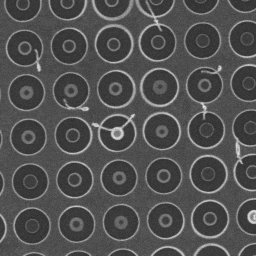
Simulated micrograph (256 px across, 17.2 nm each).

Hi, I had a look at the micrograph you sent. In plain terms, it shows an array of small figures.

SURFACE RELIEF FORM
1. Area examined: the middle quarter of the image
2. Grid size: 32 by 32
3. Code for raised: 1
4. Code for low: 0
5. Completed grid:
11111111111111111111111111111111
11111111111111111111110001111111
00011111111000001111100000011111
00000111100000000111000000001110
00000011100000000111000000001110
01000011000011000110000110000110
01100011000011000010000110001110
01100011100010000111000000001110
00000011100000000111000000001111
00000111110000001111100000011111
00001111111000011111111101111111
11111111111111111111111111111111
11111111111111111111111000111111
10011111111000001111100000011111
00000111110000000111000000001110
00000011100000000111000000000110
01100001100011000011000111000110
01110001100011000011000110000110
01110001100001000011000000000111
00000011100000000111100000001111
00000011110000000111110000011111
00000111111100011111111111111111
11111111111111111111111111111111
11111111111111111111111101111111
11011111111100001111110000001111
00000011111000000111100000000111
00000011110000000011100000000111
00100001100001100011100011000111
01110001100001100011000111000111
01110001100001100011100000000111
00100001110000000011100000000111
00000011110000000111110000001111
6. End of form